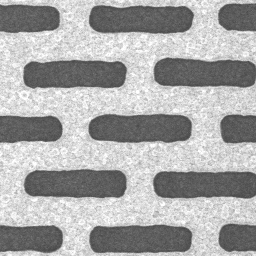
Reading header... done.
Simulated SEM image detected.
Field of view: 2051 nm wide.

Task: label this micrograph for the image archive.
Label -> holes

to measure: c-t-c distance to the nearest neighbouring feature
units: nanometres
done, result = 682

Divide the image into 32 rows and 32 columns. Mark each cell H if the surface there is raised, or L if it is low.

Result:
HHLHHHHHHHHHHHHHHHHHHHHHHHHHHLLL
LLLLLLLHHHHLLLLLLLLLLLLLHHHLLLLL
LLLLLLLLHHHLLLLLLLLLLLLLHHHLLLLL
LLLLLLLHHHHHLLLLLLLLLLLLHHHHLLLL
HHHHHHHHHHHHHHHHHHHHHHHHHHHHHHHH
HHHHHHHHHHHHHHHHHHHHHHHHHHHHHHHH
HHHHHHHHHHHHHHHHHHHHHHHHHHHHHHHH
HHHHHHHHHLHHHHHHHHHHLLLLLHHHLHHH
HHHLLLLLLLLLLLLLHHHLLLLLLLLLLLLL
HHHLLLLLLLLLLLLLHHHLLLLLLLLLLLLL
HHHLLLLLLLLLLLLHHHHHLLLLLLLLLLLL
HHHHHHHHHHHHHHHHHHHHHHHHHHHHHHHH
HHHHHHHHHHHHHHHHHHHHHHHHHHHHHHHH
HHHHHHHHHHHHHHHHHHHHHHHHHHHHHHHH
LLLHHHLHHHHHLLLLLLLLLLLHHHHHLLLL
LLLLLLLLHHHLLLLLLLLLLLLLHHHHLLLL
LLLLLLLLHHHLLLLLLLLLLLLLHHHHLLLL
LLLLLLLHHHHHLLLLLLLLLLLHHHHHLLLL
HHHHHHHHHHHHHHHHHHHHHHHHHHHHHHHH
HHHHHHHHHHHHHHHHHHHHHHHHHHHHHHHH
HHHHHHHHHHHHHHHHHHHHHHHHHHHHHHHH
HHHHLLLLLLLLLLLHHHHHLLLLLLHHLLLH
HHHLLLLLLLLLLLLLHHHLLLLLLLLLLLLL
HHHLLLLLLLLLLLLLHHHLLLLLLLLLLLLL
HHHHLLLLLLLLLLLHHHHHLLLLLLLLLLLL
HHHHHHHHHHHHHHHHHHHHHHHHHHHHHHHH
HHHHHHHHHHHHHHHHHHHHHHHHHHHHHHHH
HHHHHHHHHHHHHHHHHHHHHHHHHHHHHHHH
LLLLLLLHHHHHLLLLLLLLLLLHHHHHLLLL
LLLLLLLLHHHLLLLLLLLLLLLLHHHLLLLL
LLLLLLLLHHHLLLLLLLLLLLLLHHHLLLLL
HHHHHLLHHHHHLLLLLLLLLLLHHHHHHHLH